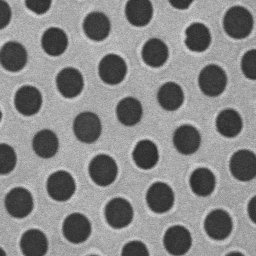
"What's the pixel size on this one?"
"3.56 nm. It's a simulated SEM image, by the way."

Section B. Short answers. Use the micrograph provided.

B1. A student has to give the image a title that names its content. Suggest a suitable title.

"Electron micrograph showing a regular array of holes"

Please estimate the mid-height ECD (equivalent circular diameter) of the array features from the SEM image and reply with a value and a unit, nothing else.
30 pixels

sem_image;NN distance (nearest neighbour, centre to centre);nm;160